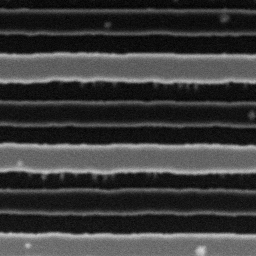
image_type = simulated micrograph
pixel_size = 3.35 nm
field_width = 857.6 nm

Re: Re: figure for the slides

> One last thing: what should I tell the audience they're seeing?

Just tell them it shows lines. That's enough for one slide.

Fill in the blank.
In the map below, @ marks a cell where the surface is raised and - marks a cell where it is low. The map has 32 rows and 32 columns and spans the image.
--------------------------------
@@@@@@@@@@@@@@@@@@@@@@@@@@@@@@@@
@@@@@@@@@@@@@@@@@@@@@@@@@@@@@@@@
@@@@@@@@@@@@@@@@@@@@@@@@@@@@@@@@
--------------------------------
--------------------------------
--------------------------------
@@@@@@@@@@@@@@@@@@@@@@@@@@@@@@@@
@@@@@@@@@@@@@@@@@@@@@@@@@@@@@@@@
@@@@@@@@@@@@@@@@@@@@@@@@@@@@@@@@
--------------------------@-----
--------------------------------
--------------------------------
@@@@@@@@@@@@@@@@@@@@@@@@@@@@@@@@
@@@@@@@@@@@@@@@@@@@@@@@@@@@@@@@@
@@@@@@@@@@@@@@@@@@@@@@@@@@@@@@@@
--------------------------------
--------------------------------
@@@@@@@@@@@@@@@@@@@@@@@@@@@@@@@@
@@@@@@@@@@@@@@@@@@@@@@@@@@@@@@@@
@@@@@@@@@@@@@@@@@@@@@@@@@@@@@@@@
----@@@@@@@@@@@@@---@@@@@@@@@@@@
--------------------------------
--------------------------------
@@@@@@@@@@@@@@@@@@@@@@@@@@@@@@@@
@@@@@@@@@@@@@@@@@@@@@@@@@@@@@@@@
@@@@@@@@@@@@@@@@@@@@@@@@@@@@@@@@
--------------------------------
--------------------------------
@@@@@@@@@@@@@@@@@@@@@@@@@@@@@@@@
@@@@@@@@@@@@@@@@@@@@@@@@@@@@@@@@
@@@@@@@@@@@@@@@@@@@@@@@@@@@@@@@@